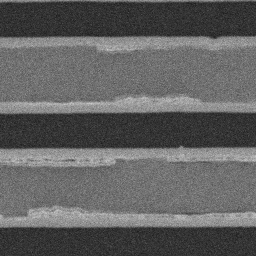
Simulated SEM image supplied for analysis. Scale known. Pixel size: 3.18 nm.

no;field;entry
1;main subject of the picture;one or a few lines or trenches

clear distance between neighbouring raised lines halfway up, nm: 140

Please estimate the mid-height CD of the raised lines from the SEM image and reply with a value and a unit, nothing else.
0.22 um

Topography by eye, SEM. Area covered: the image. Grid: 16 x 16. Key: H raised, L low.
LLLLLLLLLLLLLLLL
LLLLLLLLLLLLLLLL
LLLLLLLLLLLLLLLL
HHHHHHHHHHHHHHHH
HHHHHHHHHHHHHHHH
HHHHHHHHHHHHHHHH
HHHHHHHHHHHHHHHH
LLLLLLLLLLLLLLLL
LLLLLLLLLLLLLLLL
LLLLLLLLLLLLLLLL
HHHHHHHHHHHHHHHH
HHHHHHHHHHHHHHHH
HHHHHHHHHHHHHHHH
HHHHHHHHHHHHHHHH
LLLLLLLLLLLLLLLL
LLLLLLLLLLLLLLLL